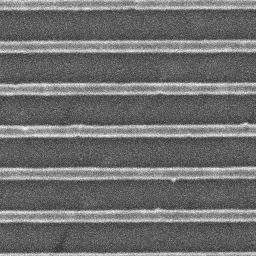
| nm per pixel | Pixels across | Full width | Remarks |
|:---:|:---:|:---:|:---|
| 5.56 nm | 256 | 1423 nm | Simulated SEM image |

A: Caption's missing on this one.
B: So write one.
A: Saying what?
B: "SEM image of parallel lines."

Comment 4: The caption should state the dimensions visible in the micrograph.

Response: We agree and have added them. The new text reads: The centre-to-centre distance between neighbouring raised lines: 0.236 µm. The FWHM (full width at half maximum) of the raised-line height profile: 54.9 nanometres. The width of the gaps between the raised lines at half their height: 0.18 µm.